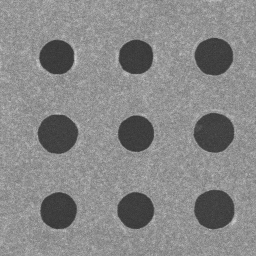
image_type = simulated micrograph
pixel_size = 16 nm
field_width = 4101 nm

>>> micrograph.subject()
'a regular array of holes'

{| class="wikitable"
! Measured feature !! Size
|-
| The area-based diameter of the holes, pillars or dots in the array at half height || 36.9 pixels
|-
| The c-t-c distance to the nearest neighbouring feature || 1230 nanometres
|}